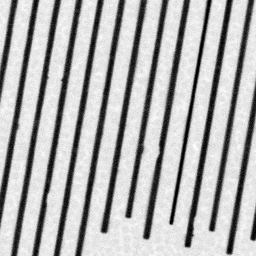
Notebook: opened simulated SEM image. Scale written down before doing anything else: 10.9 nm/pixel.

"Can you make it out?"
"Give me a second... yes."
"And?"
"parallel lines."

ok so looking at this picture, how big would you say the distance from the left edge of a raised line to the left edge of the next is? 230 nanometres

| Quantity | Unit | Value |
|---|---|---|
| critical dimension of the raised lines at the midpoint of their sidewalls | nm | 161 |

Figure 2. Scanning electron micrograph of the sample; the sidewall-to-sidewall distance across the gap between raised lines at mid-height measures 74.9 nanometres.